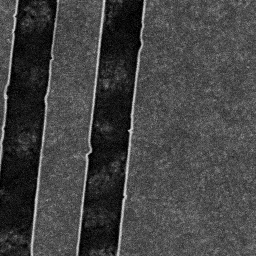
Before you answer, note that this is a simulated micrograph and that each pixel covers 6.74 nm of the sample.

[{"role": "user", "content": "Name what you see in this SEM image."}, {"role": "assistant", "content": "one or a few lines or trenches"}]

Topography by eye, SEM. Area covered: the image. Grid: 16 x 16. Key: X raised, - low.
X---XX---XXXXXXX
X--XXX---XXXXXXX
X--XXX---XXXXXXX
X--XXX---XXXXXXX
X--XXX---XXXXXXX
---XXX--XXXXXXXX
---XXX--XXXXXXXX
---XXX--XXXXXXXX
---XXX--XXXXXXXX
---XXX--XXXXXXXX
--XXX---XXXXXXXX
--XXX---XXXXXXXX
--XXX---XXXXXXXX
--XXX---XXXXXXXX
--XXX---XXXXXXXX
--XXX--XXXXXXXXX